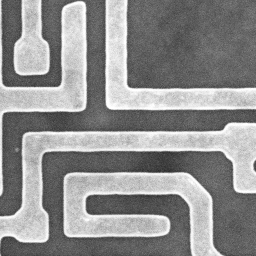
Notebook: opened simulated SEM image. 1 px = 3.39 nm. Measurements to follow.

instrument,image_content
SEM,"wiring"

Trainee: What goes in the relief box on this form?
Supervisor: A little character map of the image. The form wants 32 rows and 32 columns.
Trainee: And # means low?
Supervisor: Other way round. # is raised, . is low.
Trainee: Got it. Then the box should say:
...##....#...###................
...##...###..###................
...##...###..###................
...##...###..###................
...##...###..###................
..####..###..###................
..####..###..###................
..####..###..###................
..####..###..###................
........###..###................
........###..###................
###########..###################
###########..###################
###########...##################
................................
.............................##.
...........................#####
...#############################
...#############################
...##.......................####
...##........................###
...##........................###
...##...################.....###
...##...#################....###
...##...###............###......
...##...###.............##......
..####..###.............##......
######..#############...##......
######..#############...##......
######..................##......
........................###.....
........................###.....